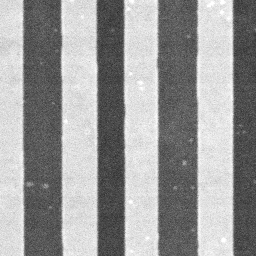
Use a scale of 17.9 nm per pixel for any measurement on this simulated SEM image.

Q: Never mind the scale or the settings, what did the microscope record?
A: lines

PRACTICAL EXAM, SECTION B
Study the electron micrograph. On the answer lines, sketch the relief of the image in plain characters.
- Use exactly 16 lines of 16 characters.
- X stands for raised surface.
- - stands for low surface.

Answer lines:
X---XX--XX--XXX-
X---XX--XX--XXX-
X---XX--XX--XXX-
X---XX--XX--XXX-
X---XX--XX--XXX-
X---XX--XX--XXX-
X---XX--XX--XXX-
X---XX--XX--XXX-
X---XX--XX--XXX-
X---XX--XX--XXX-
X---XX--XX--XXX-
X---XX--XX--XXX-
X---XX--XX--XXX-
X---XX--XX--XXX-
X---XX--XX--XXX-
X---XX--XX--XXX-